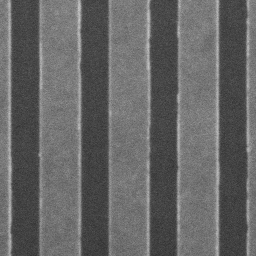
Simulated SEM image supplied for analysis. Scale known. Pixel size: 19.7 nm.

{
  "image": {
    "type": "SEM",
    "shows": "lines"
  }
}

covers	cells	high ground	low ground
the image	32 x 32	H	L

HLLLLHHHHHLLLLHHHHHLLLHHHHHLLLLH
HLLLLHHHHHLLLLHHHHHLLLHHHHHLLLLH
HLLLLHHHHHLLLLHHHHHLLLHHHHHLLLLH
HLLLLHHHHHLLLLHHHHHLLLHHHHHLLLLH
HLLLLHHHHHLLLLHHHHHLLLHHHHHLLLLH
HLLLLHHHHHLLLLHHHHHLLLHHHHHLLLLH
HLLLLHHHHHLLLLHHHHHLLLHHHHHLLLLH
HLLLLHHHHHLLLLHHHHHLLLHHHHHLLLLH
HLLLLHHHHHLLLLHHHHHLLLHHHHHLLLLH
HLLLLHHHHHLLLLHHHHHLLLHHHHHLLLLH
HLLLLHHHHHLLLLHHHHHLLLHHHHHLLLLH
HLLLLHHHHHLLLLHHHHHLLLHHHHHLLLLH
HLLLLHHHHHLLLLHHHHHLLLHHHHHLLLLH
HLLLLHHHHHLLLLHHHHHLLLHHHHHLLLLH
HLLLLHHHHHLLLLHHHHHLLLHHHHHLLLLH
HLLLLHHHHHLLLLHHHHHLLLHHHHHLLLLH
HLLLLHHHHHLLLLHHHHHLLLHHHHHLLLLH
HLLLLHHHHHLLLLHHHHHLLLHHHHHLLLLH
HLLLLHHHHHLLLLHHHHHLLLHHHHHLLLLH
HLLLLHHHHHLLLLHHHHHLLLHHHHHLLLLH
HLLLLHHHHHLLLLHHHHHLLLHHHHHLLLLH
HLLLLHHHHHLLLLHHHHHLLLHHHHHLLLLH
HLLLLHHHHHLLLLHHHHHLLLHHHHHLLLLH
HLLLLHHHHHLLLLHHHHHLLLHHHHHLLLLH
HLLLLHHHHHLLLLHHHHHLLLHHHHHLLLLH
HLLLLHHHHHLLLLHHHHHLLLHHHHHLLLLH
HLLLLHHHHHLLLLHHHHHLLLHHHHHLLLLH
HLLLLHHHHHLLLLHHHHHLLLHHHHHLLLLH
HLLLLHHHHHLLLLHHHHHLLLHHHHHLLLLH
HLLLLHHHHHLLLLHHHHHLLLHHHHHLLLLH
HLLLLHHHHHLLLLHHHHHLLLHHHHHLLLLH
HLLLLHHHHHLLLLHHHHHLLLHHHHHLLLLH